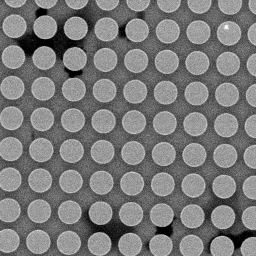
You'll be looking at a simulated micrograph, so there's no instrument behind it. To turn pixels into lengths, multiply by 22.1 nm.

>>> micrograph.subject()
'an array of small figures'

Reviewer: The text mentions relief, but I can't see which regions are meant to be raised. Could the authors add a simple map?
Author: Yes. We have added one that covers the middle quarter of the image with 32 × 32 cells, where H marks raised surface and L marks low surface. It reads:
HHHHHLLLHHHHHLLLHHHHHLLHHHHHLLLH
LLHHLLLLLHHHLLLLHHHHLLLLHHHHLLLH
LLLLLLLLLLLLLLLLLLLLLLLLLLLLLLLL
LLLLLLLLLLLLLLLLLLLLLLLLLLLLLLLL
HHHHHLLLHHHHLLLLHHHLLLLLLHHLLLLL
HHHHHLLLHHHHHLLHHHHHLLLHHHHHLLLH
HHHHHLLHHHHHHLLHHHHHHLLHHHHHLLHH
HHHHHLLHHHHHHLLHHHHHHLLHHHHHLLHH
LHHHLLLLHHHHLLLHHHHHLLLHHHHHLLLH
LLLLLLLLLLLLLLLLHHHLLLLLHHHLLLLH
LLLLLLLLLLLLLLLLLLLLLLLLLLLLLLLL
LHHHLLLLLHHLLLLLLLLLLLLLLLLLLLLL
HHHHHLLLHHHHLLLLHHHHLLLLHHHLLLLL
HHHHHLLHHHHHHLLHHHHHLLLHHHHHLLHH
HHHHHLLHHHHHHLLHHHHHLLHHHHHHLLHH
HHHHHLLHHHHHHLLHHHHHLLHHHHHHLLHH
LHHHLLLLHHHHLLLHHHHHLLLHHHHLLLHH
LLLLLLLLLLLLLLLLLLLLLLLLHHLLLLLL
LLLLLLLLLLLLLLLLLLLLLLLLLLLLLLLL
HHHHLLLLHHHLLLLLHHLLLLLLLLLLLLLL
HHHHHLLHHHHHLLLHHHHHLLLHHHHLLLLH
HHHHHLLHHHHHLLLHHHHHLLHHHHHHLLHH
HHHHHLLHHHHHLLHHHHHHLLHHHHHHLLHH
HHHHLLLHHHHHLLLHHHHHLLHHHHHHLLHH
LLLLLLLLHHHLLLLLHHHLLLLHHHHLLLHH
LLLLLLLLLLLLLLLLLLLLLLLLLLLLLLLL
LLLLLLLLLLLLLLLLLLLLLLLLLLLLLLLL
HHHHLLLHHHHLLLLHHHHLLLLHHHLLLLLL
HHHHLLLHHHHHLLLHHHHHLLHHHHHLLLHH
HHHHHLLHHHHHLLHHHHHHLLHHHHHLLLHH
HHHHLLLHHHHHLLHHHHHHLLHHHHHLLLHH
HHHHLLLHHHHHLLLHHHHLLLHHHHHLLLHH